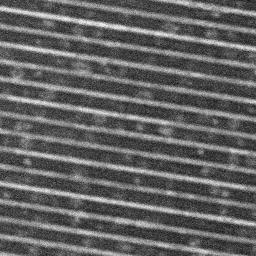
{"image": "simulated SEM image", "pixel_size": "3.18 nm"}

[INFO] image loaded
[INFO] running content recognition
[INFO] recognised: parallel lines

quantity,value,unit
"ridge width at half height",11.4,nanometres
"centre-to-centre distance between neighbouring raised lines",55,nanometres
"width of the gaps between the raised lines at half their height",0.0452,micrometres